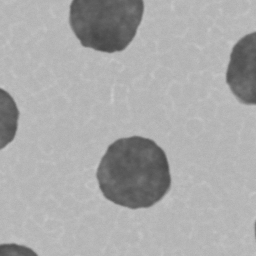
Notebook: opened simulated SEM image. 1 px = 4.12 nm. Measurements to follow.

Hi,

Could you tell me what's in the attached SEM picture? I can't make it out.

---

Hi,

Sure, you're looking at holes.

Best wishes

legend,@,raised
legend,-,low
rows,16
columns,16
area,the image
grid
@@@@-----@@@@@@@
@@@@-----@@@@@@@
@@@@@---@@@@@@@-
@@@@@@@@@@@@@@--
@@@@@@@@@@@@@@--
@@@@@@@@@@@@@@--
-@@@@@@@@@@@@@@@
-@@@@@@@@@@@@@@@
-@@@@@@@@@@@@@@@
@@@@@@@---@@@@@@
@@@@@@-----@@@@@
@@@@@@-----@@@@@
@@@@@@@---@@@@@@
@@@@@@@@@@@@@@@@
@@@@@@@@@@@@@@@@
--@@@@@@@@@@@@@@